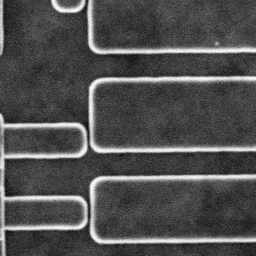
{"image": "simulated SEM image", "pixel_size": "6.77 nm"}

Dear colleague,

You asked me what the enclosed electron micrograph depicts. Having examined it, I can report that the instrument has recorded wiring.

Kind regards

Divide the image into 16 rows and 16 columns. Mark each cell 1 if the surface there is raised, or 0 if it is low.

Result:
0000111111111111
0000001111111111
0000001111111111
0000000000000000
0000000000000000
0000001111111111
0000001111111111
0000001111111111
1111111111111111
1111100000000000
0000000000000000
0000001111111111
1111101111111111
1111111111111111
0000001111111111
0000000000000000